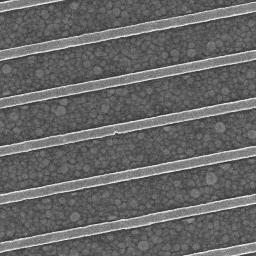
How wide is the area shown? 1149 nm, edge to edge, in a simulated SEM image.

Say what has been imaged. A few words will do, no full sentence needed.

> parallel lines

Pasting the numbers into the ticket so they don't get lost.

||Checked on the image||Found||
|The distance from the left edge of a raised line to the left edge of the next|47.2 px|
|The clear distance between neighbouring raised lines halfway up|169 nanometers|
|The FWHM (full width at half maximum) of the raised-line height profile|41.3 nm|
